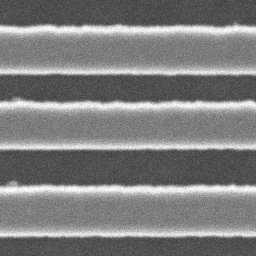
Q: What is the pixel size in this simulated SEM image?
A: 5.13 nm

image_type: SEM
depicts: lines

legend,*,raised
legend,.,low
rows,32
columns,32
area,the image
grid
................................
................................
................................
....***...*...**......*.........
********************************
********************************
********************************
********************************
********************************
................................
................................
................................
................................
********************************
********************************
********************************
********************************
********************************
**********.*******.*..**.*...**.
................................
................................
................................
................................
...*******.*****.**..*.*********
********************************
********************************
********************************
********************************
********************************
*******..**.***....****.....*.**
................................
................................